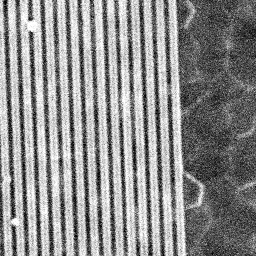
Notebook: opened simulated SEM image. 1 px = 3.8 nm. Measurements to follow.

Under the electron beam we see parallel lines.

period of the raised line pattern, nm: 46.9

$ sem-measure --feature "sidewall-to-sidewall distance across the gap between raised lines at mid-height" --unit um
0.0228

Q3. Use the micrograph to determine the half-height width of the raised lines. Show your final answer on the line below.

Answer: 7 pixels